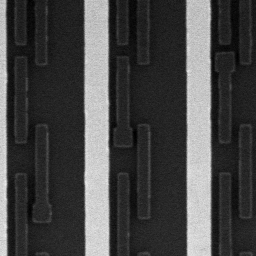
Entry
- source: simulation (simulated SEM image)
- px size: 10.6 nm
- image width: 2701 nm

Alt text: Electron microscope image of wiring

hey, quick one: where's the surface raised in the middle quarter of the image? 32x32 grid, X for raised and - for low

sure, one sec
-----XXXXXX--XXX---------------X
-----XXXXXX--XXX---------------X
-----XXXXXX--XXX---------------X
-----XXXXXX--XXX---------------X
-----XXXXXX--XXX---------------X
-----XXXXXX--XXX---------------X
-----XXXXXX--XXX---------------X
-----XXXXXX--XXX---------------X
-----XXXXXX--XXX---------------X
-----XXXXXX--XXX---------------X
-----XXXXXX--XXX---------------X
-----XXXXXX--XXX---------------X
-----XXXXXX--XXX---------------X
------XXXXX--XXX---------------X
------XXXXX--XXX---------------X
------XXXXX--XXX---XX----------X
------XXXXX--XXXX--XX----------X
-----XXXXXX--XXXX--XX----------X
-----XXXXXX--XXXX--XX----------X
------XXXXX--XXXX--XX----------X
------XXXXX--XXXX--XX----------X
------XXXXX--------XX----------X
------XXXXX--------XX----------X
------XXXXX--------XX----------X
------XXXXX--------XX----------X
------XXXXX--------XX----------X
------XXXXX--------XX----------X
-----XXXXXX---XX---XX----------X
-----XXXXXX---XX---XX----------X
-----XXXXXX---XX---XX----------X
------XXXXX---XX---XX----------X
------XXXXX---XX---XX----------X